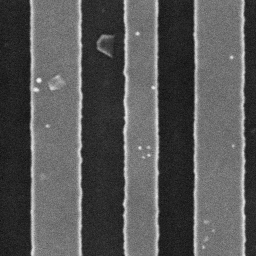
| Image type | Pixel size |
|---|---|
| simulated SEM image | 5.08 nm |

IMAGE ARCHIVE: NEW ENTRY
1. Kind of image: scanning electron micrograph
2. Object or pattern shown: lines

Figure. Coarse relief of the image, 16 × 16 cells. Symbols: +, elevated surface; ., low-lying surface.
..+++...++..+++.
..+++...++..+++.
..+++...++..+++.
..+++...++..+++.
..+++...++..+++.
..+++...++..+++.
..+++...++..+++.
..+++...++..+++.
..+++...++..+++.
..+++...++..+++.
..+++...++..+++.
..+++...++..+++.
..+++...++..+++.
..+++...++..+++.
..+++...++..+++.
..+++...++..+++.